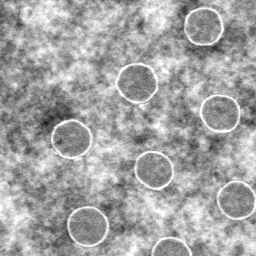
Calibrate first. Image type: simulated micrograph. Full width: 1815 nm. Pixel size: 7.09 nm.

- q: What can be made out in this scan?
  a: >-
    raised bodies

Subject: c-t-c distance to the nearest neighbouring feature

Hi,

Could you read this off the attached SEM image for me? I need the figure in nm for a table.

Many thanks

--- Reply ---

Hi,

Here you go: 617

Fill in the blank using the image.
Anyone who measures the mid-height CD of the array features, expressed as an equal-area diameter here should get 278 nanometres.